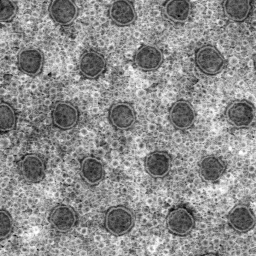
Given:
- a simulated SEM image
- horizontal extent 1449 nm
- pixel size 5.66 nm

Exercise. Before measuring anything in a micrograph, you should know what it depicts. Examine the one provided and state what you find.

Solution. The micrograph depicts a regular array of raised bodies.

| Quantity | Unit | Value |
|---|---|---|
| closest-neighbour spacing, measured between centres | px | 57.3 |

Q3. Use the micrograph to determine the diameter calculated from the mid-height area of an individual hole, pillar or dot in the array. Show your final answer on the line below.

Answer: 138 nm